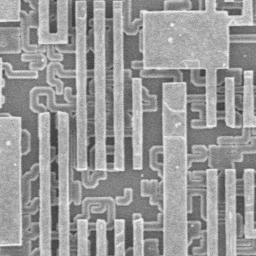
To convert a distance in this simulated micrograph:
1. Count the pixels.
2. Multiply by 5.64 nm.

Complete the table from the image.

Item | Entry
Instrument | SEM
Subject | wiring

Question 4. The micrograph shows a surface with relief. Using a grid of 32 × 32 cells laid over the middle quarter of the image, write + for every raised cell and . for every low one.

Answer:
...++...++..+++.....++++++++++++
...++...++..+++.................
...++...++..+++.................
...++...++..+++.................
...++...++..+++..++.............
...++...++..+++..++......+++++..
...++...++..+++..++......+++++..
...++...++...++..++......+++++..
...++...++...++..++......+++++..
...++...++...++..++......+++++..
...++...++...++..++......+++++..
...++...++...++..++......+++++..
+..++...++...++..++......+++++..
+..+++..++...++..++......+++++..
+..+++..++...++..++......+++++..
+..+++..++...++..++......+++++..
+..++...++...++..++......+++++..
+..++...++...++..++......+++++..
+..++...++...++..++......+++++..
+..++...++...++..++......+++++..
+..++...++...++...+......+++++..
+..+++..++...++...+......+++++..
+..+++..++...++...+......+++++..
+..+++..++...++...+......+++++..
+..+++..++...++...+......+++++..
+..+++..++...++...+......+++++..
+........................+++++..
+........................+++++..
+........................+++++..
+........................+++++..
+........................+++++..
+........................+++++..